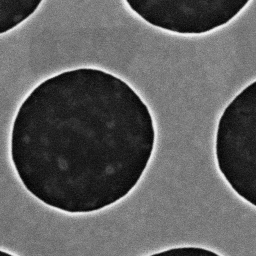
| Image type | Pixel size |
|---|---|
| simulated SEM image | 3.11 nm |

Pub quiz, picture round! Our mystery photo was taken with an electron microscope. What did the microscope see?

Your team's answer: holes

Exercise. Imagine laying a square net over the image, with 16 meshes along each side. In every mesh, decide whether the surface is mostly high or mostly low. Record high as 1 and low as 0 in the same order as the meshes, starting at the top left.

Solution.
0011111100000001
0111111110000011
1111111111111111
1111111111111111
1111000111111111
1100000011111110
1000000001111100
1000000000111100
1000000000111000
1000000000111000
1000000001111100
1000000011111100
1110000111111110
1111111111111111
1111111111111111
1111111111100111